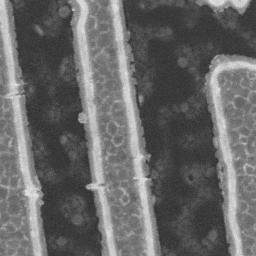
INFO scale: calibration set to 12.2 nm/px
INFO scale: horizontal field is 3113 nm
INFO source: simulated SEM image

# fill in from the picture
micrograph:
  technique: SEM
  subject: one or a few lines or trenches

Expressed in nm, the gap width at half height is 911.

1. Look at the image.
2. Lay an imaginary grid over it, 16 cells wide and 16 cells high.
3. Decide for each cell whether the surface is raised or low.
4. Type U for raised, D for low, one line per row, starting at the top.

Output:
DDDDDUUDDDDDDDDD
DDDDDUUDDDDDDDDD
DDDDDUUDDDDDDDDD
UDDDDUUUDDDDDDDD
UDDDDUUUDDDDDDUU
UDDDDDUUDDDDDUUU
UDDDDDUUDDDDDDUU
UDDDDDUUDDDDDDUU
UDDDDDUUDDDDDDUU
UDDDDDUUUDDDDDUU
UUDDDDUUUDDDDDUU
UUDDDDUUUDDDDDUU
UUDDDDUUUDDDDDDU
UUDDDDDUUDDDDDDU
UUDDDDDUUDDDDDDU
UUDDDDDUUDDDDDDU